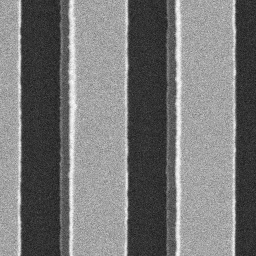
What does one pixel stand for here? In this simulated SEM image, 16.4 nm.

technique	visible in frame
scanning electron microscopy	lines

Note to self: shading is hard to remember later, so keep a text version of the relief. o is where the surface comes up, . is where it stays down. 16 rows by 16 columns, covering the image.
o...oooo...oooo.
o...oooo...oooo.
o...oooo...oooo.
o...oooo...oooo.
o...oooo...oooo.
o...oooo...oooo.
o...oooo...oooo.
o...oooo...oooo.
o...oooo...oooo.
o...oooo...oooo.
o...oooo...oooo.
o...oooo...oooo.
o...oooo...oooo.
o...oooo...oooo.
o...oooo...oooo.
o...oooo...oooo.